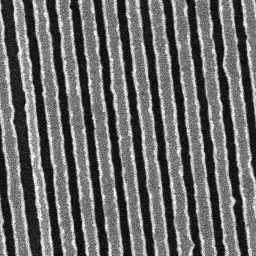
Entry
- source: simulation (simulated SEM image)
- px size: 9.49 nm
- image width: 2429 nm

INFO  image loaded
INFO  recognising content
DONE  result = parallel lines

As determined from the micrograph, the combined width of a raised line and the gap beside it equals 0.218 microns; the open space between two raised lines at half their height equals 89.5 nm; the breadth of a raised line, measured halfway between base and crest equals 131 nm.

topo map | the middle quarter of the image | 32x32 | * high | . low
***...***...***..****..****..***
****..***...***..****..****..***
****..***...***..****..****..***
****..***...***..****...***..***
****..****..***...***...***..***
.***..****..****..***...***...**
.***..****..****..***...***...**
.***..****..****..****..***...**
.***...***..****..****..***...**
.***...***..****..****..****..**
.***...***..****..****..****..**
.****..***...***..****..****..**
.****..****..***...***..****..**
..***..****..***...***...***..**
.****..****..***...***...***..**
..***...***..****..***...***...*
..***...***...***..****..***...*
..***...***...***...***..***...*
..***...***...***...***..****..*
..****..***...***...***..****..*
..****..****..***...***...***..*
..****..****..***...***...***...
...***..****..***...***...***...
...***..****..****..***...***...
...***...***...***..***...***...
*..***...***...***..****..***...
*..***...***...***..****..****..
*..***...***...***...***..****..
*..****..***...***...***...***..
*..****..****..***...***...***..
*...***..****..***...***...***..
*...***..****..***...****..***..